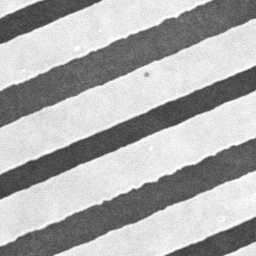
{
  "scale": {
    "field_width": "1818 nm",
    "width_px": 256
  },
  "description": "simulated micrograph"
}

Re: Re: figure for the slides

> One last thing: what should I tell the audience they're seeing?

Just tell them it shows lines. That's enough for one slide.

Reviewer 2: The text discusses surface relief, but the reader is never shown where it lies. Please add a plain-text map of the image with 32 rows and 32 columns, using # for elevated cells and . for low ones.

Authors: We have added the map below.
####........#############.......
##........#############.........
.......##############..........#
.....##############..........###
..##############...........#####
##############...........#######
###########...........##########
#########...........############
#######...........#############.
#####..........##############...
##...........##############.....
..........##############........
........##############.......###
......#############........#####
...##############.......########
.##############.......##########
############........############
##########........#############.
########.......#############....
#####........#############......
###.......##############........
#.......##############..........
......##############.........###
....#############..........#####
.##############.........########
############..........##########
##########..........############
########..........#############.
######.........##############...
###..........#############......
#.........##############.......#
........##############.......###